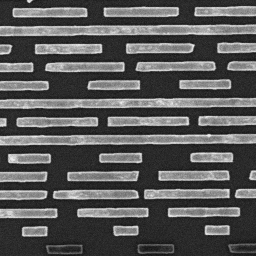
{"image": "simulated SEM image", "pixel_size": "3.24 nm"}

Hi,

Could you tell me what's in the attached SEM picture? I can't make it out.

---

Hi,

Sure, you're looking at wiring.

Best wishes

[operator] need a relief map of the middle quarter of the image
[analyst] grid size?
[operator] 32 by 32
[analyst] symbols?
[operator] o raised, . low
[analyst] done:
ooooooooooooooo...oooooooooooooo
ooooooooooooooo...oooooooooooooo
................................
................................
......ooooooooooooo..........ooo
......ooooooooooooo..........ooo
................................
................................
................................
oooooooooooooooooooooooooooooooo
oooooooooooooooooooooooooooooooo
................................
................................
.....ooo...oooooooooooooooooooo.
oooooooo...oooooooooooooooooooo.
................................
................................
................................
oooooooooooooooooooooooooooooooo
oooooooooooooooooooooooooooooooo
................................
................................
............ooooooo.............
.........oooooooooo.............
..................o.............
................................
................................
.oooooooooooooooooo.....oooooooo
.ooooooooooooooooo......oooooooo
................................
................................
............................oo..